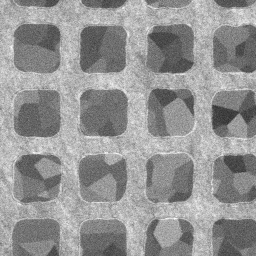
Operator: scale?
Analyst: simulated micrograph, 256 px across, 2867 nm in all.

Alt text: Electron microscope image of a regular array of raised bodies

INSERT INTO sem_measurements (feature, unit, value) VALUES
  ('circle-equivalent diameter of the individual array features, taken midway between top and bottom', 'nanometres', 598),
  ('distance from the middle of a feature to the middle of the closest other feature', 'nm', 727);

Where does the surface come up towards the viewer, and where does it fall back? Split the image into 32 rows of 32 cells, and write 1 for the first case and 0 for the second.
00111110001111110011111100011111
00000000000000000011000000000000
01100000000101000000000000010000
00111110000111110011111100011111
00111111001111110011111100011111
00111111001111110011111100011111
00111111001111110011111100011111
00111111001111110011111100111111
00111110001111110011111100011111
00000000000000000000000001000000
00000000000000000000000010000000
00111110001111100001111100011111
00111111001111110011111100111111
00111111001111110011111100111111
00111111001111110011111100111111
00111111011111110011111100111111
00111110001111110001111100011111
00000000000000000000000000000000
00000000000000000000000000001000
01111110000111100001111100001111
00111111101111110011111100011111
00111111111111110011111100011111
01111111001111110011111100011111
00111111001111110011111100011111
00111110001111100011111100011111
00100000000000000000000000000000
00000000000000000000000000000000
00111110000111100001111000011111
00111111001111110011111100111111
00111111001111110011111100011111
01111111001111110011111100011111
00111111001111110011111100011111